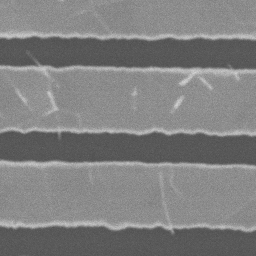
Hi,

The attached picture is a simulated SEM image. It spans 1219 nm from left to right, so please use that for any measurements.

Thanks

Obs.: lines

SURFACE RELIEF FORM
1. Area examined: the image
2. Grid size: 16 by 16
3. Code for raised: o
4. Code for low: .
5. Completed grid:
oooooooooooooooo
oooooooooooooooo
................
................
oooooooooooooooo
oooooooooooooooo
oooooooooooooooo
oooooooooooooooo
................
................
oooooooooooooooo
oooooooooooooooo
oooooooooooooooo
oooooooooooooooo
................
................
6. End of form